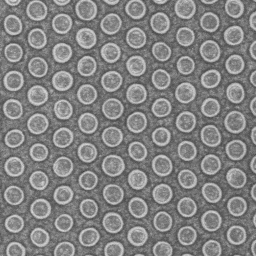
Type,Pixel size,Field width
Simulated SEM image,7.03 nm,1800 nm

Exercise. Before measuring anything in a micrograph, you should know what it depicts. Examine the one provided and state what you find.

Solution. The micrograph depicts a regular array of raised bodies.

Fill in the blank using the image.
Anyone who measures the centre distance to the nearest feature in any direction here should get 196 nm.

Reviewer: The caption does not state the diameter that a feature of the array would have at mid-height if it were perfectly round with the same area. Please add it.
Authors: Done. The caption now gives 0.125 µm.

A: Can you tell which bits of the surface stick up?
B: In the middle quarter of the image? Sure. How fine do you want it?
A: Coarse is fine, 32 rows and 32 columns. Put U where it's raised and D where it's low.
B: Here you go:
DDDDUUUUDDDDDDDDUUUUDDDDDDDDDUUU
DDDDUUUUDDDDDDDDUUUUDDDDDDDDDUUU
UDDDUUUDDDDUUDDDDUUDDDUUUUDDDDDD
UUDDDDDDDDUUUUDDDDDDDDUUUUDDDDDD
UUDDDDDDDDUUUUDDDDDDDDUUUUDDDDDD
UDDDDUDDDDUUUUDDDUUDDDDUUUDDDUUU
DDDDUUUUDDDUDDDDUUUUDDDDDDDDUUUU
DDDDUUUUDDDDDDDDUUUUDDDDDDDDUUUU
DDDDUUUUDDDDDDDDUUUUDDDDDDDDUUUU
UDDDDUUDDDUUUUDDDUUDDDDUUUDDDDUD
UUDDDDDDDDUUUUDDDDDDDDUUUUDDDDDD
UUDDDDDDDDUUUUUDDDDDDDUUUUDDDDDD
UUDDDDDDDDUUUUDDDUUUDDDUUUDDDDUU
UDDDUUUUDDDDUDDDUUUUDDDDDDDDDUUU
DDDDUUUUDDDDDDDDUUUUDDDDDDDDUUUU
DDDDUUUUDDDDDDDDUUUUDDDDDDDDUUUU
UDDDDUUDDDUUUUDDDUUDDDDUUDDDDDUU
UUDDDDDDDDUUUUDDDDDDDDUUUUDDDDDD
UUDDDDDDDDUUUUDDDDDDDDUUUUDDDDDD
UUDDDDDDDDUUUUDDDDDDDDDUUUDDDDUD
DDDDUUUDDDDDDDDDDUUUDDDDDDDDDUUU
DDDDUUUUDDDDDDDDUUUUDDDDDDDDDUUU
DDDDUUUUDDDDDDDDDUUUDDDDDDDDDUUU
DDDDUUUUDDDUUUDDDUUUDDDUUUDDDDUU
UUDDDDDDDDUUUUDDDDDDDDUUUUUDDDDD
UUDDDDDDDDUUUUUDDDDDDDUUUUUDDDDD
UUDDDDDDDDUUUUDDDDDDDDDUUUUDDDDD
UDDDDUUDDDDUUDDDDUUUDDDDUUDDDUUU
DDDDUUUUDDDDDDDDUUUUDDDDDDDDDUUU
DDDDUUUUDDDDDDDDUUUUDDDDDDDDDUUU
DDDDUUUUDDDUUDDDDUUUDDDDUDDDDDUU
UUDDDDDDDDUUUUDDDDDDDDDUUUUDDDDD